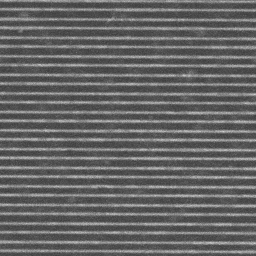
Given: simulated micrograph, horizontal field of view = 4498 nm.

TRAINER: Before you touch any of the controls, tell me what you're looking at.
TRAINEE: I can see parallel lines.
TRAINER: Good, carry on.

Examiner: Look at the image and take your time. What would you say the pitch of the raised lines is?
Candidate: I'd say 163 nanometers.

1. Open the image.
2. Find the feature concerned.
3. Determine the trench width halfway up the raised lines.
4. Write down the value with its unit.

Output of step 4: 0.127 um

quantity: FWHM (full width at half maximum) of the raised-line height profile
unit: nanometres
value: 35.1